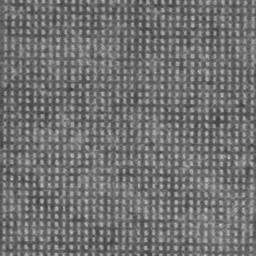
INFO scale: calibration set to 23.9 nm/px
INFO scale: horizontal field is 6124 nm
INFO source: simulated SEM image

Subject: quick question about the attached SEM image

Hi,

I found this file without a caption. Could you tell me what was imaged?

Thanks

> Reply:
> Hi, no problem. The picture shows a regular array of raised bodies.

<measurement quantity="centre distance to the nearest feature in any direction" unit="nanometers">173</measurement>